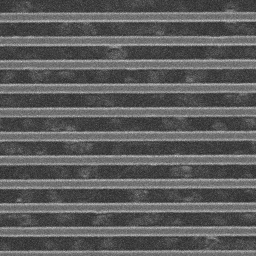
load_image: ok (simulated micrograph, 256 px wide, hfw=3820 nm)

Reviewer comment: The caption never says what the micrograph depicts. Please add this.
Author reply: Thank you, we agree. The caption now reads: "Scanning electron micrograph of parallel lines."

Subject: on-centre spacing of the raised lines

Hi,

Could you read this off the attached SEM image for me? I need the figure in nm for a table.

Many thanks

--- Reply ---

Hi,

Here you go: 355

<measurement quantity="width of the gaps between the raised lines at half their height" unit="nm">229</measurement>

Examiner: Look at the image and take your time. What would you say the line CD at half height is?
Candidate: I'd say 127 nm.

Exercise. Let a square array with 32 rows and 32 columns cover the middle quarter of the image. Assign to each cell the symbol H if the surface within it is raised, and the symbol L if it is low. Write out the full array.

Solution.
HHHHHHHHHHHHHHHHHHHHHHHHHHHHHHHH
LLLLLLLLLLLLLLLLLLLLLLLLLLLLLLLL
LLLLLLLLLLLLLLLLLLLLLLLLLLLLLLLL
LLLLLLLLLLLLLLLLLLLLLLLLLLLLLLLL
LLLLLLLLLLLLLLLLLLLLLLLLLLLLLLLL
HHHHHHHHHHHHHHHHHHHHHHHHHHHHHHHH
HHHHHHHHHHHHHHHHHHHHHHHHHHHHHHHH
LLLLLLLLLLLLLLLLLLLLLLLLLLLLLLLL
LLLLLLLLLLLLLLLLLLLLLLLLLLLLLLLL
LLLLLLLLLLLLLLLLLLLLLLLLLLLLLLLL
LLLLLLLLLLLLLLLLLLLLLLLLLLLLLLLL
HHHHHHHHHHHHHHHHHHHHHHHHHHHHHHHH
HHHHHHHHHHHHHHHHHHHHHHHHHHHHHHHH
LLLLLLLLLLLLLLLLLLLLLLLLLLLLLLLL
LLLLLLLLLLLLLLLLLLLLLLLLLLLLLLLL
LLLLLLLLLLLLLLLLLLLLLLLLLLLLLLLL
LLLLLLLLLLLLLLLLLLLLLLLLLLLLLLLL
HHHHHHHHHHHHHHHHHHHHHHHHHHHHHHHH
HHHHHHHHHHHHHHHHHHHHHHHHHHHHHHHH
LLLLLLLLLLLLLLLLLLLLLLLLLLLLLLLL
LLLLLLHLLLLLLLLLLLLLLLLLLLLLLLLL
LLLLLLLLLLLLLLLLLLLLLLLLLLLLLLLL
LLLLLLLLLLLLLLLLLLLLLLLLLLLLLLLL
HHHHHHHHHHHHHHHHHHHHHHHHHHHHHHHH
HHHHHHHHHHHHHHHHHHHHHHHHHHHHHHHH
LLLLLLLLLLLLLLLLLLLLLLLLLLLLLLLL
LLLLLLLLLLLLLLLLLLLLLLLLLLLHLLLL
LLLLHHLLLLLLLLLLLLLLLLLLLLLLLLLL
LLLLLLLLLLLLLLLLLLLLLLLLLLLLLLLL
HHHHHHHHHHHHHHHHHHHHHHHHHHHHHHHH
HHHHHHHHHHHHHHHHHHHHHHHHHHHHHHHH
LLLLLLLLLLLLLLLLLLLLLLLLLLLLLLLL